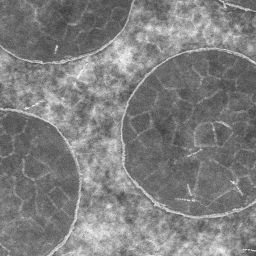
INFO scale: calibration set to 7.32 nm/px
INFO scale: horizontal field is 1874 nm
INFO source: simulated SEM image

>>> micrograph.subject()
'raised bodies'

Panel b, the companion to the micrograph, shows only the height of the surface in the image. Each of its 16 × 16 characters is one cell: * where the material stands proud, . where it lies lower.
********.......*
********........
*******.........
.****......****.
.........*******
.........*******
........********
***.....********
****....********
*****...********
*****...********
*****...********
*****....*******
*****.......**..
****............
****............